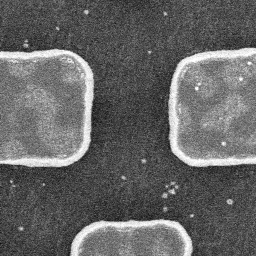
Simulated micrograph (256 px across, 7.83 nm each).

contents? raised bodies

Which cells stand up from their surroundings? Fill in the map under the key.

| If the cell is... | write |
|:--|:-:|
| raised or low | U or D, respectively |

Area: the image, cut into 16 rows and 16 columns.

DDDDDDDDDDDDDDDD
DDDDDDDDDDDDDDDD
DDDDDDDDDDDDDDDD
UUUUUDDDDDDDDUUU
UUUUUUDDDDDUUUUU
UUUUUUDDDDDUUUUU
UUUUUUDDDDDUUUUU
UUUUUUDDDDDUUUUU
UUUUUDDDDDDUUUUU
UUUUUDDDDDDUUUUU
DDDDDDDDDDDDDDDD
DDDDDDDDDDDDDDDD
DDDDDDDDDDDDDDDD
DDDDDDDDDDDDDDDD
DDDDDUUUUUUDDDDD
DDDDDUUUUUUUDDDD